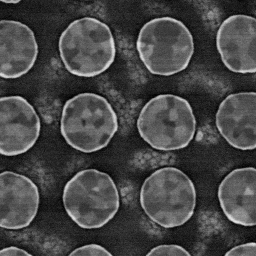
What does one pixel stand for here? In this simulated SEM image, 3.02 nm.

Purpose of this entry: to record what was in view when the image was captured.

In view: raised bodies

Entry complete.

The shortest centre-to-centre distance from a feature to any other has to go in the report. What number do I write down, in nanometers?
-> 228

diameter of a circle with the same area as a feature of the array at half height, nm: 169